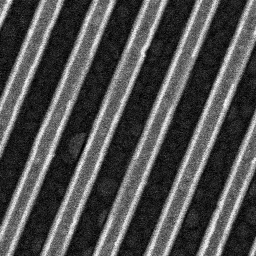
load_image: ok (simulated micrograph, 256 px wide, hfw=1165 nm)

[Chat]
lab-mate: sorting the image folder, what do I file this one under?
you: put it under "parallel lines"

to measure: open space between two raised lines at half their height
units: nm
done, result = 126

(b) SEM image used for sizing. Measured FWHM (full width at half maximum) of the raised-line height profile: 95 nm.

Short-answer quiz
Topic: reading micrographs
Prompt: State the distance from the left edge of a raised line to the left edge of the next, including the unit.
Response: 0.219 micrometres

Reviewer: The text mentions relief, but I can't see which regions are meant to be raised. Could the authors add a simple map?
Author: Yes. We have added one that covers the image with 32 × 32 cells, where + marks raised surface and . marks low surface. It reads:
+....+++...+++....+++...+++....+
+...+++....+++...+++....+++....+
....+++....++....+++....++....++
....++....+++....++....+++....++
...+++....+++...+++....++....+++
...+++...+++....+++...+++....+++
...++....+++....++....+++....++.
..+++....++....+++....++....+++.
..++....+++....++....+++....++..
.+++....++....+++....++....+++..
.+++...+++....+++...+++....+++..
.++....+++....++....+++...+++...
+++....++....+++....++....+++...
++....+++....++....+++....++....
++....+++...+++....++....+++....
++...+++....+++...+++....+++...+
+....+++...+++....+++...+++....+
+...+++....+++....++....+++....+
....+++....++....+++....++....++
....+++...+++....++....+++....++
...+++....+++...+++....+++...+++
...+++...+++....+++...+++....+++
...++....+++...+++....+++....++.
..+++....++....+++....++....+++.
..++....+++....++....+++....++..
.+++....+++...+++....+++...+++..
.+++...+++....+++...+++....+++..
+++....+++...+++....+++...+++...
+++...+++....+++....++....+++...
++....+++....++....+++....++....
++....++....+++....++....+++....
++...+++....++....+++....+++...+